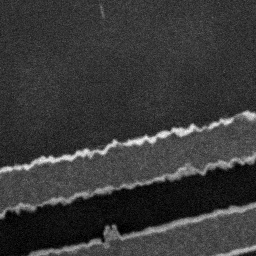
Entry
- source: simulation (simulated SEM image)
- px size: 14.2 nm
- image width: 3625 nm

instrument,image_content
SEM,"one or a few lines or trenches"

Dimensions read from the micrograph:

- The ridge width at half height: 0.599 microns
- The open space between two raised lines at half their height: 0.672 um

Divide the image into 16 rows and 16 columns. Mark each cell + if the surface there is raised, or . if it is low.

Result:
................
................
................
................
................
................
................
..............++
..........++++++
......++++++++++
.++++++++++++...
+++++++++.......
++++............
.............+++
.........+++++++
....++++++++++++